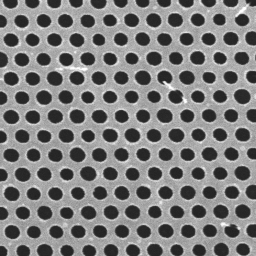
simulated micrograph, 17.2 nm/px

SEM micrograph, a regular array of holes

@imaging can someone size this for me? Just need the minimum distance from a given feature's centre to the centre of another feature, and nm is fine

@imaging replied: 372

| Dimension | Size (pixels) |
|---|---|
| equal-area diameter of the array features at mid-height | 14.2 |